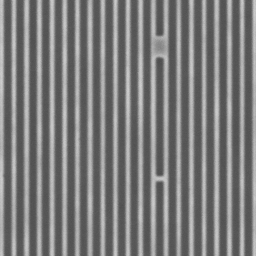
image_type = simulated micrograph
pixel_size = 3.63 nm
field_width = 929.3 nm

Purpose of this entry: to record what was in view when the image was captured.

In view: parallel lines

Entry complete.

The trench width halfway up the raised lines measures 30.4 nanometers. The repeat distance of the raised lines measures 12.7 pixels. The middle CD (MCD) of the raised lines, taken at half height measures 16.8 nanometers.